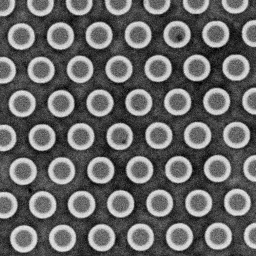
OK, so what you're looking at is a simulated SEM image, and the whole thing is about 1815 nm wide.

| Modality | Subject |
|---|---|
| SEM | an array of small figures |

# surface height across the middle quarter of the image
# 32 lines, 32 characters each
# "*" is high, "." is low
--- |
.******....******...*******...**
.******....******...*******...**
.******....******....******...**
..****.....*****.....*****.....*
...**...........................
................................
..................**.......***..
**.....****.....*****.....*****.
**....******....******...*******
**....******...*******...*******
**....******....******...*******
**....******....*****.....*****.
*......****......***.......***..
................................
................................
..****......****.....*****.....*
.******....******....******...**
.******....******....******...**
.******....******....******...**
.******....******....******...**
..*****.....****......****.....*
................................
................................
........**.......***.......***..
**.....*****....******....*****.
**....******....******...*******
***...******....******...*******
**....******....******...*******
**.....*****....*****.....*****.
*.......***.......**........**..
................................
................................